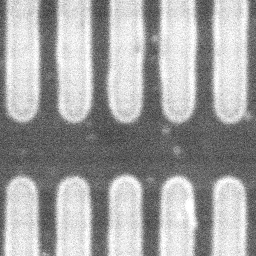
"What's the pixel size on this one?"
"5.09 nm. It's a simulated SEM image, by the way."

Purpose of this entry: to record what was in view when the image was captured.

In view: groups of lines, slits or small figures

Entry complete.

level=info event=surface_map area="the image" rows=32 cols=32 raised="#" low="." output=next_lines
#...####...###...###....###....#
#...####...###...###....###....#
#...####...###...###....###....#
#...####...###....##....###...##
#...####...###....##....###...##
#....###...###....##....###...##
#....##....###....##....###...##
#....###...###...###....###...##
#....###...###...###....###...##
#....###...###...###....###....#
#....###...###...####...###...##
#....###...###...####...###...##
#...####...###...####...###...##
#...####...###...####...###...##
##..####..#####..####..#####..##
################################
################################
################################
################################
################################
################################
################################
#########.#####.################
#...####...###...####...###...##
#...####...###...####...###...##
#...###....###...###....###...##
#...###....###...###....###...##
#...###....###...###....###...##
#...###....###...###....###...##
#...###....###...###....###...##
#...###....###...###....###...##
#...###....###...###....###...##